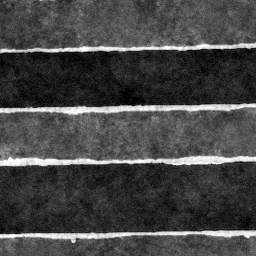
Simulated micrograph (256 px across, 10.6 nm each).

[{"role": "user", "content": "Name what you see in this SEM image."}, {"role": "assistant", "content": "lines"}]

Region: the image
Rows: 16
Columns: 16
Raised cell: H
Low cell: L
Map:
HHHHHHHHHHHHHHHH
HHHHHHHHHHHHHHHH
HHHHHHHHHHHHHHHH
LLLLLLLLLLLLLLLL
LLLLLLLLLLLLLLLL
LLLLLLLLLLLLLLLL
LLLLLLLLLLLLLLLL
HHHHHHHHHHHHHHHH
HHHHHHHHHHHHHHHH
HHHHHHHHHHHHHHHH
LLLLLLLLLLLLLLLL
LLLLLLLLLLLLLLLL
LLLLLLLLLLLLLLLL
LLLLLLLLLLLLLLLL
LLLLLLLLLLLLLLLL
HHHHHHHHHHHHHHHH